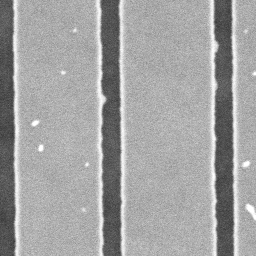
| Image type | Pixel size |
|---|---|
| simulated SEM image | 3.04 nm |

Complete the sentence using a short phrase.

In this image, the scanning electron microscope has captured lines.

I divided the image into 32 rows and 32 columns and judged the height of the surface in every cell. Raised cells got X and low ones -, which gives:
--XXXXXXXXXX---XXXXXXXXXXXX--XXX
--XXXXXXXXXXX--XXXXXXXXXXXX--XXX
--XXXXXXXXXXX--XXXXXXXXXXXX--XXX
--XXXXXXXXXXX--XXXXXXXXXXXX--XXX
--XXXXXXXXXX---XXXXXXXXXXXX--XXX
--XXXXXXXXXXX--XXXXXXXXXXXX--XXX
--XXXXXXXXXXX--XXXXXXXXXXXX--XXX
--XXXXXXXXXXX--XXXXXXXXXXXX--XXX
--XXXXXXXXXXX--XXXXXXXXXXXX--XXX
--XXXXXXXXXXX--XXXXXXXXXXXX--XXX
--XXXXXXXXXXX--XXXXXXXXXXXX--XXX
--XXXXXXXXXXX--XXXXXXXXXXXX--XXX
--XXXXXXXXXXX--XXXXXXXXXXXX--XXX
--XXXXXXXXXXX--XXXXXXXXXXXX--XXX
--XXXXXXXXXXX--XXXXXXXXXXXX--XXX
--XXXXXXXXXXX--XXXXXXXXXXXX--XXX
--XXXXXXXXXXX--XXXXXXXXXXXX--XXX
--XXXXXXXXXXX--XXXXXXXXXXXX--XXX
--XXXXXXXXXXX--XXXXXXXXXXXX--XXX
--XXXXXXXXXXX--XXXXXXXXXXXX--XXX
--XXXXXXXXXXX--XXXXXXXXXXXX--XXX
--XXXXXXXXXXX--XXXXXXXXXXXX--XXX
--XXXXXXXXXXX--XXXXXXXXXXXX--XXX
--XXXXXXXXXXX--XXXXXXXXXXXX--XXX
--XXXXXXXXXXX--XXXXXXXXXXXX--XXX
--XXXXXXXXXXX--XXXXXXXXXXXX--XXX
--XXXXXXXXXXX--XXXXXXXXXXXX--XXX
--XXXXXXXXXXX--XXXXXXXXXXXX--XXX
--XXXXXXXXXXX--XXXXXXXXXXXX--XXX
--XXXXXXXXXXX--XXXXXXXXXXXX--XXX
--XXXXXXXXXXX--XXXXXXXXXXXX--XXX
--XXXXXXXXXXX--XXXXXXXXXXXX--XXX